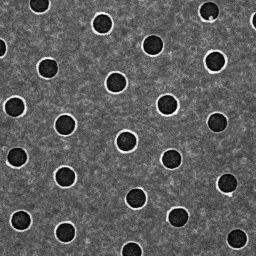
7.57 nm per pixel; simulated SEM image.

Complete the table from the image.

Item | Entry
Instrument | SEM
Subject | a regular array of holes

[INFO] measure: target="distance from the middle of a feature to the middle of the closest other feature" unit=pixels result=51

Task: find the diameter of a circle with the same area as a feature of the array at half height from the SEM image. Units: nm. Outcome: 148